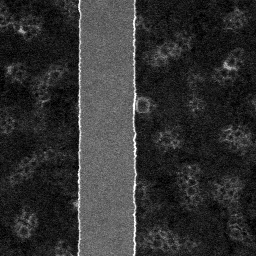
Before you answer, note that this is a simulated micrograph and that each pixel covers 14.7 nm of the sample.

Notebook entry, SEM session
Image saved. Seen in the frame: one or a few lines or trenches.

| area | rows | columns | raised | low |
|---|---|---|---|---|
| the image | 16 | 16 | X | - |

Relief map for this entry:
XXXXX---XXXXXXXX
XXXXX---XXXXXXXX
XXXXX---XXXXXXXX
XXXXX---XXXXXXXX
XXXXX---XXXXXXXX
XXXXX---XXXXXXXX
XXXXX---XXXXXXXX
XXXXX---XXXXXXXX
XXXXX---XXXXXXXX
XXXXX---XXXXXXXX
XXXXX---XXXXXXXX
XXXXX---XXXXXXXX
XXXXX---XXXXXXXX
XXXXX---XXXXXXXX
XXXXX---XXXXXXXX
XXXXX---XXXXXXXX